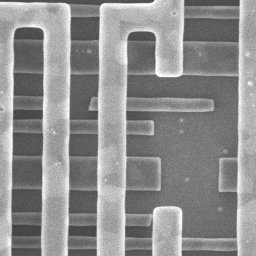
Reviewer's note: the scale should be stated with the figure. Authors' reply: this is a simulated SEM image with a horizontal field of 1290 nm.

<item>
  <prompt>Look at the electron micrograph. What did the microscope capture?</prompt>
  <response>wiring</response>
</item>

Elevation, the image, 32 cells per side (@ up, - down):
@@@@@@@@-----@@@-@@@@@@-------@@
@@@@@@@@@----@@@@@@@@@@-------@@
@@@@@@@@@----@@@@@@@@@@-------@@
@@@--@@@@----@@@@@@@@@@-------@@
@@---@@@@---@@@@---@@@@-------@@
@@---@@@@---@@@@----@@@-------@@
@@---@@@@---@@@@----@@@-------@@
@@---@@@@---@@@@----@@@-------@@
@@---@@@@---@@@@----@@@-------@@
@@---@@@@---@@@@----@@--------@@
@@---@@@@---@@@@--------------@@
@@---@@@@---@@@@--------------@@
@@---@@@@---@@@@--------------@@
@@---@@@@---@@@@--------------@@
@@---@@@@---@@@@--------------@@
@@---@@@@---@@@@--------------@@
@@---@@@@---@@@@--------------@@
@@---@@@@---@@@@--------------@@
@@---@@@----@@@@--------------@@
@@---@@@@---@@@@--------------@@
@----@@@@---@@@@--------------@@
@----@@@@---@@@@--------------@@
@----@@@@---@@@@--------------@@
@----@@@@---@@@@--------------@@
@----@@@@---@@@@--------------@@
@----@@@----@@@@--------------@@
@----@@@----@@@@---@@@@-------@@
@----@@@----@@@@---@@@@-------@@
@----@@@----@@@@---@@@@-------@@
@----@@@----@@@@---@@@@-------@@
@----@@@----@@@@---@@@@-------@@
@----@@@----@@@@---@@@@-------@@